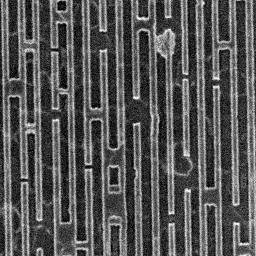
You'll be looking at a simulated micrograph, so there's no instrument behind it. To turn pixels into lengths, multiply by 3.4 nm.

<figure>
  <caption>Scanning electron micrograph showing parallel lines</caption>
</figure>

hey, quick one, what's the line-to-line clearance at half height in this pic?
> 0.0349 µm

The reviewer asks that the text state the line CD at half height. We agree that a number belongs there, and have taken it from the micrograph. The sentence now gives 20.4 nanometers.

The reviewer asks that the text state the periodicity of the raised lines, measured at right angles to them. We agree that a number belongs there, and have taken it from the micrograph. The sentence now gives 55.4 nm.